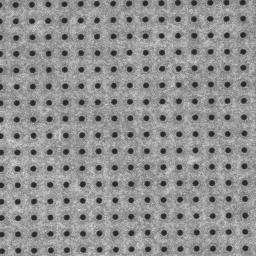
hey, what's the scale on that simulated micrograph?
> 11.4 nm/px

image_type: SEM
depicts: a regular array of holes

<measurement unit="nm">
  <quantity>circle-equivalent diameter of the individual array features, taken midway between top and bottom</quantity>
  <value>67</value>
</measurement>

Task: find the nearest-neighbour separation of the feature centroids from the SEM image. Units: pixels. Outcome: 16